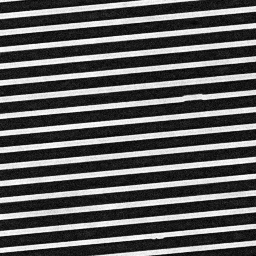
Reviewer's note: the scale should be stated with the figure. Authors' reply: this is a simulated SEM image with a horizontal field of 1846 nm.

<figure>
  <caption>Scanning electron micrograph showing parallel lines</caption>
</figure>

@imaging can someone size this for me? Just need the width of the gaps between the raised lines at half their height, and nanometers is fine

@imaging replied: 86.1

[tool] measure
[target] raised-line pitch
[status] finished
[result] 120 nm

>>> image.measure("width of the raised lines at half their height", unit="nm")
35.9